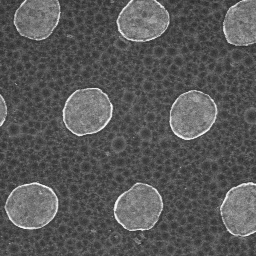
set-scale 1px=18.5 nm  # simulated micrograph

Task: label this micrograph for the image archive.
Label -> raised bodies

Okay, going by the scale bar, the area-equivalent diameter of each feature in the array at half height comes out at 875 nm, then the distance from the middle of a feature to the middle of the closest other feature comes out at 106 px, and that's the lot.